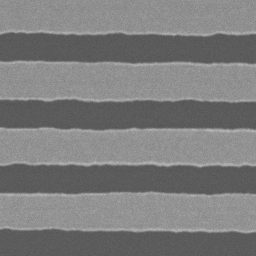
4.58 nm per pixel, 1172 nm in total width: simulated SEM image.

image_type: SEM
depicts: lines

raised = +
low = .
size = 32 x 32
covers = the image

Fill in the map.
++++++++++++++++++++++++++++++++
++++++++++++++++++++++++++++++++
++++++++++++++++++++++++++++++++
++++++++++++++++++++++++++++++++
.........................+......
................................
................................
................................
++++++++++++++++++++++++++++++++
++++++++++++++++++++++++++++++++
++++++++++++++++++++++++++++++++
++++++++++++++++++++++++++++++++
...+.++...+++++++++++++.++++++++
................................
................................
................................
++++++++++++++++++++++++++++++++
++++++++++++++++++++++++++++++++
++++++++++++++++++++++++++++++++
++++++++++++++++++++++++++++++++
+...+++++++++.++++.+++++++++++++
................................
................................
................................
++++++++++++++++++++++++++++++++
++++++++++++++++++++++++++++++++
++++++++++++++++++++++++++++++++
++++++++++++++++++++++++++++++++
++++++++++++++++++++++++++++++++
................................
................................
................................